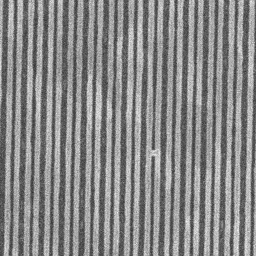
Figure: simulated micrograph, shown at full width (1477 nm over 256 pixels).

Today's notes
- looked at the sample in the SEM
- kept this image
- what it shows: parallel lines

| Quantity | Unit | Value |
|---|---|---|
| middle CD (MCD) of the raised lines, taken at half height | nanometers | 28.1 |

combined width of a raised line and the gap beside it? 57.8 nanometers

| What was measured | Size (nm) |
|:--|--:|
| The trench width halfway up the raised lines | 33.1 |